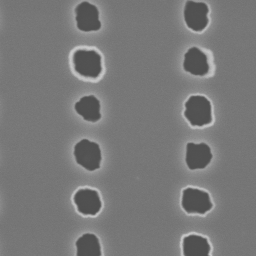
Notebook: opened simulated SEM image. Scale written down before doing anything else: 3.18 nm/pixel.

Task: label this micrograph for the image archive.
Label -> a regular array of holes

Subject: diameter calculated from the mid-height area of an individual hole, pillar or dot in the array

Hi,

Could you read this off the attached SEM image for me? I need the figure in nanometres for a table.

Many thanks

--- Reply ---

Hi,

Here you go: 85.3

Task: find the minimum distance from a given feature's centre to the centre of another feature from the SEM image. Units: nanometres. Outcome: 144